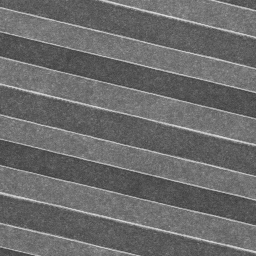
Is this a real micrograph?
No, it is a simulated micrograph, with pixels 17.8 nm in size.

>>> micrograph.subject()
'lines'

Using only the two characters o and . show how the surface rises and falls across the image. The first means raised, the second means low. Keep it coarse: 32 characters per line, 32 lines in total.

...............ooooooooooooo....
oo.................ooooooooooooo
oooooo.................ooooooooo
ooooooooooo................ooooo
..ooooooooooooo................o
......ooooooooooooo.............
...........oooooooooooo.........
o..............oooooooooooo.....
oooooo.............ooooooooooooo
oooooooooo..............oooooooo
oooooooooooooo.............ooooo
....oooooooooooooo..............
........oooooooooooooo..........
.............ooooooooooooo......
o................ooooooooooooo..
ooooo................ooooooooooo
ooooooooo................ooooooo
.oooooooooooo................ooo
.....oooooooooooo...............
.........oooooooooooo...........
.............oooooooooooo.......
ooo..............ooooooooooooo..
oooooooo.............ooooooooooo
oooooooooooo..............oooooo
..oooooooooooooo..............oo
......oooooooooooooo............
...........oooooooooooooo.......
...............oooooooooooooo...
oo.................ooooooooooooo
ooooooo................ooooooooo
ooooooooooo.................oooo
...oooooooooooo.................